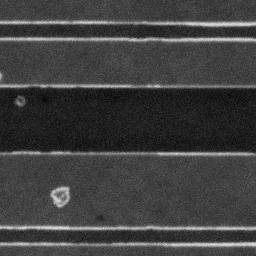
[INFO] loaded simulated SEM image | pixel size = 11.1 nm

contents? lines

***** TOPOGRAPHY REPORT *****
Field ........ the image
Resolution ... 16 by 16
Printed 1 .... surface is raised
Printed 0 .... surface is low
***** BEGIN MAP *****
1111111111111111
1111111111111111
1111111111111111
1111111111111111
1111111111111111
0000000000000000
0000000000000000
0000000000000000
0000000000000000
0000000000000000
1111111111111111
1111111111111111
1111111111111111
1111111111111111
1111111111111111
1111111111111111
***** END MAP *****